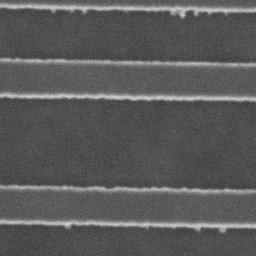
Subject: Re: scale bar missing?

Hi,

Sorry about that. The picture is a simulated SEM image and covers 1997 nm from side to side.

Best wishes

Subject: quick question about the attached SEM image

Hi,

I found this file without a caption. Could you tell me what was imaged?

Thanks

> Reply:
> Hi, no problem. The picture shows lines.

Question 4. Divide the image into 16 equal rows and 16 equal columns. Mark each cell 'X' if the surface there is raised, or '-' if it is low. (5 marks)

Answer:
----XXXXXXXXXXXX
----------------
----------------
----------------
XXXXXXXXXXXXXXXX
XXXXXXXXXXXXXXXX
----------------
----------------
----------------
----------------
----------------
----------------
XXXXXXXXXXXXXXXX
XXXXXXXXXXXXXXXX
----------------
----------------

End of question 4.